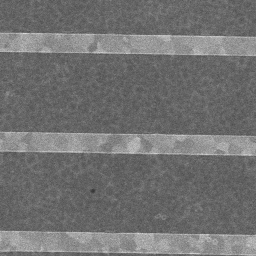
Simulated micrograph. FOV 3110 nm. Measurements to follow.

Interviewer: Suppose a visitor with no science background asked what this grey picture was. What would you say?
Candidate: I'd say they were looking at one or a few lines or trenches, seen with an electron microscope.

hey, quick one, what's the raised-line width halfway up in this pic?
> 228 nanometres